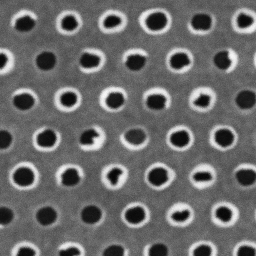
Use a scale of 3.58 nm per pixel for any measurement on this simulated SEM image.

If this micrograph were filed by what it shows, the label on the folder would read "a regular array of holes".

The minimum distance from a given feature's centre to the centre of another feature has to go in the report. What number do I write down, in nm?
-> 154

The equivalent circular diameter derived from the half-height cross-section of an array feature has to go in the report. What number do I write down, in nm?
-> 64.5